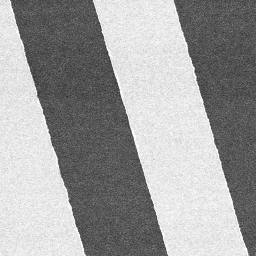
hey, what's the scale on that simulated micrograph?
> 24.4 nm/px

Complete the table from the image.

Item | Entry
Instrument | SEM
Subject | one or a few lines or trenches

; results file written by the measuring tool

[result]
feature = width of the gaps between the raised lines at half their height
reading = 1970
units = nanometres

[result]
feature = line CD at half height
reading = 1850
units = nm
